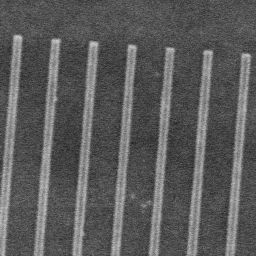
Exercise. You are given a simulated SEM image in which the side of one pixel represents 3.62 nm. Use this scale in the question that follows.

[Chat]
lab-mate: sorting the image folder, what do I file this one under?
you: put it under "parallel lines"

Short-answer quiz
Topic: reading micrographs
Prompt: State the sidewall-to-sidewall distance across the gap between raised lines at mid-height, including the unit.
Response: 109 nanometers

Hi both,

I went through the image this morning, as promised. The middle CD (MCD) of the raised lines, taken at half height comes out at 28.8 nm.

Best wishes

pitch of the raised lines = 138 nanometers